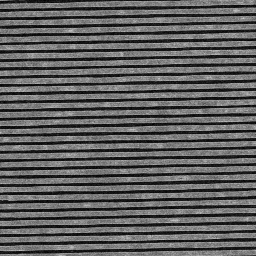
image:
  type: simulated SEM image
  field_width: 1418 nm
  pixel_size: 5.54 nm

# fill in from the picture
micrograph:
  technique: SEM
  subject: parallel lines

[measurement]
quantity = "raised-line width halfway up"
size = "0.027 um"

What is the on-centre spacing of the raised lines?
0.0463 um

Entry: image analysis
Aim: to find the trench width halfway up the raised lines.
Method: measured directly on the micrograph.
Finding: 19.4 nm